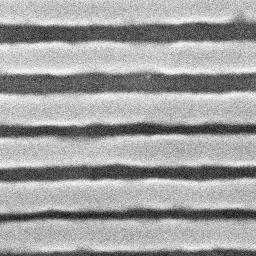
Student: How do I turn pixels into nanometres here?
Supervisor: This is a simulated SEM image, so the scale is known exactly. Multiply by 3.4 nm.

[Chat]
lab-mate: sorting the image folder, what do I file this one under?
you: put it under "lines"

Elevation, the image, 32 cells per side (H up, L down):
HHHHHHHHHHHHHHHHHHHHHHHHHHHHHHHH
HHHHHHHHHHHHHHHHHHHHHHHHHHHHHHHH
HHHHHHHHHHHHHHHHHHHHHHHHHHHHHLLL
LLLLLLLLLLLLLLLLLLLLLLLLLLLLLLLL
LLLLLLLLLLLLLLLLLLLLLLLLLLLLLLLL
LLLLLHHHLLLHHHHLLLLLLLHHHHHHHHHH
HHHHHHHHHHHHHHHHHHHHHHHHHHHHHHHH
HHHHHHHHHHHHHHHHHHHHHHHHHHHHHHHH
HHHHHHHHHHHHHHHHHHHHHHHHHHHHHHHH
LLLLLLLLLLLLLLLLLLLLLLLLLLLLLLLL
LLLLLLLLLLLLLLLLLLLLLLLLLLLLLLLL
LLLLLLLLLLLLLLLLLLLLLLLLLLLLLLLL
HHHHHHHHHHHHHHHHHHHHHHHHHHHHHHHH
HHHHHHHHHHHHHHHHHHHHHHHHHHHHHHHH
HHHHHHHHHHHHHHHHHHHHHHHHHHHHHHHH
LLLHHHHHHHHLLLLLLLLLLLLLLLLLLLLL
LLLLLLLLLLLLLLLLLLLLLLLLLLLLLLLL
HHHHHHHHLLLLHHHHHHHHHHHHHHHHHHHH
HHHHHHHHHHHHHHHHHHHHHHHHHHHHHHHH
HHHHHHHHHHHHHHHHHHHHHHHHHHHHHHHH
HHHHHHHHLLLLLLLLLHHHHHHHHLLLHHHH
LLLLLLLLLLLLLLLLLLLLLLLLLLLLLLLL
LLLLLLLLLLLLLLLLLLLHLLLLLLLLLLHH
HHHHHHHHHHHHHHHHHHHHHHHHHHHHHHHH
HHHHHHHHHHHHHHHHHHHHHHHHHHHHHHHH
HHHHHHHHHHHHHHHHHHHHHHHHHHHHHHHH
HHHLLLLLLLLLLLLLLLLLLLLLLLLLLLLL
LLLLLLLLLLLLLLLLLLLLLLLLLLLLLLLL
HHHHHHHHHHHHHHHHHHHHHHHHHHHHHHHH
HHHHHHHHHHHHHHHHHHHHHHHHHHHHHHHH
HHHHHHHHHHHHHHHHHHHHHHHHHHHHHHHH
LLLLLLLLLLLLLLLLLLLLLLLLLLLLLLLL